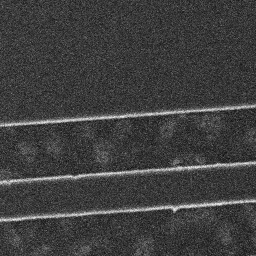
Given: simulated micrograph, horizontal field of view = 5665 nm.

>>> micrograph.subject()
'one or a few lines or trenches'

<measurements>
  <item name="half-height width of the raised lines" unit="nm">869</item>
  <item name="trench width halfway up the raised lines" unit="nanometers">1210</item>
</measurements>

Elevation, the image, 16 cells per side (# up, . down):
################
################
################
################
################
################
################
#####...........
................
................
...........#####
################
################
####............
................
................